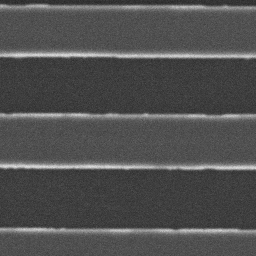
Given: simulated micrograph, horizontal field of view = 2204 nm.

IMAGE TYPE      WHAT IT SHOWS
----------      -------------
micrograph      lines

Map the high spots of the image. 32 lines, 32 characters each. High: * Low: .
................................
********************************
********************************
********************************
********************************
********************************
********************************
................................
................................
................................
................................
................................
................................
................................
**************************.*****
********************************
********************************
********************************
********************************
********************************
********************************
................................
................................
................................
................................
................................
................................
................................
................................
********************************
********************************
********************************